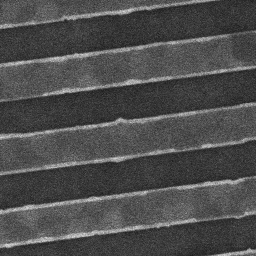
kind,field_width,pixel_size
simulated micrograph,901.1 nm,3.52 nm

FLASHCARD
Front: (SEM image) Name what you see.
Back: one or a few lines or trenches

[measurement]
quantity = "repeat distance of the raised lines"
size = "254 nm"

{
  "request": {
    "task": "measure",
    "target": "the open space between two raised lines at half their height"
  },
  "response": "122 nm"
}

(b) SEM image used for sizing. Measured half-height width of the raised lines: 130 nm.